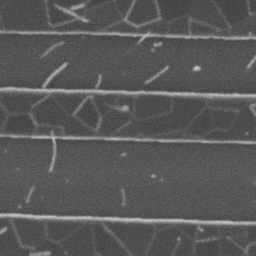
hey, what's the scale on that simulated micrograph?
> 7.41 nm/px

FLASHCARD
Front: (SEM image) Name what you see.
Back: lines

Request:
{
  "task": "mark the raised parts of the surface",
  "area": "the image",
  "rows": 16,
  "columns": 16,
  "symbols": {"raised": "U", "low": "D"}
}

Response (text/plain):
UUUUUUUUUUUUUUUU
UUUUUUUUUUUUUUUU
DDDDDDDDDDDDDDDD
DDDDDDDDDDDDDDDD
DDDDDDDDDDDDDDDD
DDDDDDDDDDDDDDDD
UUUUUUUUUUUUUUUU
UUUUUUUUUUUUUUUU
UUUUUUUUUUUUUUUU
DDDDDDDDDDDDDDDD
DDDDDDDDDDDDDDDD
DDDDDDDDDDDDDDDD
DDDDDDDDDDDDDDDD
UUDDDDDDDDDDDDDD
UUUUUUUUUUUUUUUU
UUUUUUUUUUUUUUUU